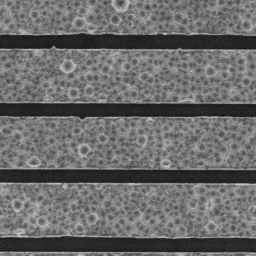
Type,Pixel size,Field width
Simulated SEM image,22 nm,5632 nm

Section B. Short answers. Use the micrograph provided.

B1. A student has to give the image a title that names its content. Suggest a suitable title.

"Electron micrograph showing one or a few lines or trenches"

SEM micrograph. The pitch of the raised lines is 1.48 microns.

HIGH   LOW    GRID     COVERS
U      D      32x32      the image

UUUUUUUUUUUUUUUUUUUUUUUUUUUUUUUU
UUUUUUUUUUUUUUUUUUUUUUUUUUUUUUUU
UUUUUUUUUUUUUUUUUUUUUUUUUUUUUUUU
UUUUUUUUUUUUUUUUUUUUUUUUUUUUUUUU
DDDDDDDDDDDDDDDDDDDDDDDDDDDDDDDD
DDDDDDDDDDDDDDDDDDDDDDDDDDDDDDDD
UUUUUUUUUUUUUUUUUUUUUUUUUUUUUUUU
UUUUUUUUUUUUUUUUUUUUUUUUUUUUUUUU
UUUUUUUUUUUUUUUUUUUUUUUUUUUUUUUU
UUUUUUUUUUUUUUUUUUUUUUUUUUUUUUUU
UUUUUUUUUUUUUUUUUUUUUUUUUUUUUUUU
UUUUUUUUUUUUUUUUUUUUUUUUUUUUUUUU
UUUUUUUUUUUUUUUUUUUUUUUUUUUUUUUU
DDDDDDDDDDDDDDDDDDDDDDDDDDDDDDDD
DDDDDDDDDDDDDDDDDDDDDDDDDDDDDDDD
UUUUUUUUUUUUUUUUUUUUUUUUUUUUUUUU
UUUUUUUUUUUUUUUUUUUUUUUUUUUUUUUU
UUUUUUUUUUUUUUUUUUUUUUUUUUUUUUUU
UUUUUUUUUUUUUUUUUUUUUUUUUUUUUUUU
UUUUUUUUUUUUUUUUUUUUUUUUUUUUUUUU
UUUUUUUUUUUUUUUUUUUUUUUUUUUUUUUU
DDDDDDDDDDDDDDDDDDDDDDDDDDDDDDDD
DDDDDDDDDDDDDDDDDDDDDDDDDDDDDDDD
UUUUUUUUUUUUUUUUUUUUUUUUUUUUUUUU
UUUUUUUUUUUUUUUUUUUUUUUUUUUUUUUU
UUUUUUUUUUUUUUUUUUUUUUUUUUUUUUUU
UUUUUUUUUUUUUUUUUUUUUUUUUUUUUUUU
UUUUUUUUUUUUUUUUUUUUUUUUUUUUUUUU
UUUUUUUUUUUUUUUUUUUUUUUUUUUUUUUU
UUUUUUUDDDDDDUUUUUUUUUUUUUUUUUUU
DDDDDDDDDDDDDDDDDDDDDDDDDDDDDDDD
DDDDDDDDDDDDDDDDDDDDDDDDDDDDDDDD